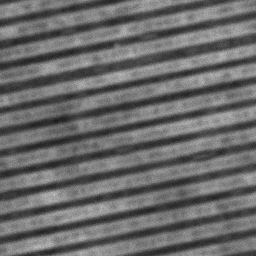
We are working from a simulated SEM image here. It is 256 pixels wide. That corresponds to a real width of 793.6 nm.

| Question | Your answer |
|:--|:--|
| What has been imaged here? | parallel lines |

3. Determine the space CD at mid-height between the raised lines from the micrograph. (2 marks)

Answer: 0.0346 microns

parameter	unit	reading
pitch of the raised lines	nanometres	66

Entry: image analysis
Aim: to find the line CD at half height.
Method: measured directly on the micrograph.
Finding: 10.3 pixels